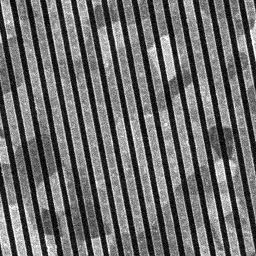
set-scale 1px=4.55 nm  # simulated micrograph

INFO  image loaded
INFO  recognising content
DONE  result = parallel lines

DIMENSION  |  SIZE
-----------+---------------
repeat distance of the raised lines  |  68.2 nanometres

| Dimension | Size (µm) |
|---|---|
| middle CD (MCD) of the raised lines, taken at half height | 0.0381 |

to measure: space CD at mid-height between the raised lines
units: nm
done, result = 30.3